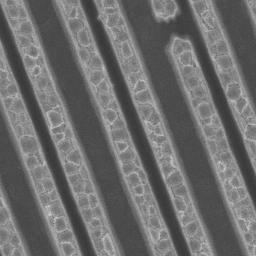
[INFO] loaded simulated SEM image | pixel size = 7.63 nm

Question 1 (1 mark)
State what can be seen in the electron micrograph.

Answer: parallel lines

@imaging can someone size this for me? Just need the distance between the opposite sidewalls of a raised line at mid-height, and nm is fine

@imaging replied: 186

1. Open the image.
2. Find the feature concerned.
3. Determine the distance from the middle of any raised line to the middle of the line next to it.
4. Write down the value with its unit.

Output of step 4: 0.33 micrometres